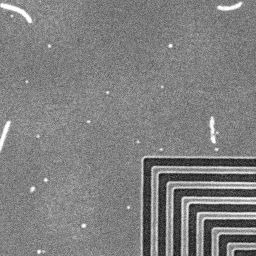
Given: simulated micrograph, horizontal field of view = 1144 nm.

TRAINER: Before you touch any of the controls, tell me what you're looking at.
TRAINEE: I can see groups of lines, slits or small figures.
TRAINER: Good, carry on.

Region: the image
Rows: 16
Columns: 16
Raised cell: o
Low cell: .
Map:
oooooooooooooooo
oooooooooooooooo
oooooooooooooooo
oooooooooooooooo
oooooooooooooooo
oooooooooooooooo
oooooooooooooooo
oooooooooooooooo
oooooooooooooooo
oooooooooooooooo
ooooooooo.......
ooooooooo.......
ooooooooo.......
ooooooooo.......
ooooooooo.......
ooooooooo.......